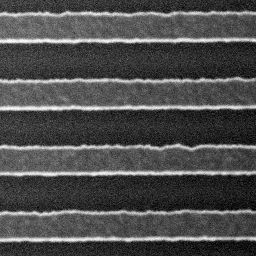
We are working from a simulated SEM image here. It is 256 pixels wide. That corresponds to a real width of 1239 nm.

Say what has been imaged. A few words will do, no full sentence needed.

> lines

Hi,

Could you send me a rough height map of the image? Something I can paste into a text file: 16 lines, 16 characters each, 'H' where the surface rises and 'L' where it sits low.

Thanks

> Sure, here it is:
LLLLLLLLLLLLLLLL
HHHHHHHHHHHHHHHH
HHHHHHHHHHHHHHHH
LLLLLLLLLLLLLLLL
LLLLLLLLLLLLLLLL
HHHHHHHHHHHHHHHH
HHHHHHHHHHHHHHHH
LLLLLLLLLLLLLLLL
LLLLLLLLLLLLLLLL
HHHHHHHHHHHHHHHH
HHHHHHHHHHHHHHHH
LLLLLLLLLLLLLLLL
LLLLLLLLLLLLLLLL
HHHHHHHHHHHHHHHH
HHHHHHHHHHHHHHHH
LLLLLLLLLLLLLLLL